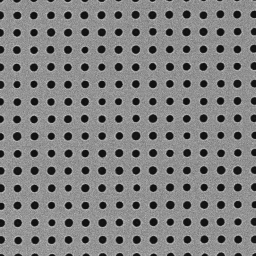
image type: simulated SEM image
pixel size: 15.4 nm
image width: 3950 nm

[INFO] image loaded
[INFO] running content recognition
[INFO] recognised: a regular array of holes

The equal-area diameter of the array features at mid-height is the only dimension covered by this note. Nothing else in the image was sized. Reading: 0.117 µm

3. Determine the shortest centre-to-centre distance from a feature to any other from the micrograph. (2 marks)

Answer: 16.7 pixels